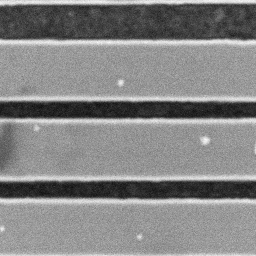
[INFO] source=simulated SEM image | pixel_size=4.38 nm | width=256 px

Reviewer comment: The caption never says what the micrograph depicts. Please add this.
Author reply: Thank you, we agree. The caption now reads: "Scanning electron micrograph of lines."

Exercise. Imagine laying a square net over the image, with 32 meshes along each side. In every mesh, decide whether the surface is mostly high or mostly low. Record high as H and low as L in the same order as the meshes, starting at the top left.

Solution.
HHHHHHHHHHHLLHHHLLLLLLLLLLLLLLLL
LLLLLLLLLLLLLLLLLLLLLLLLLLLLLLLL
LLLLLLLLLLLLLLLLLLLLLLLLLLLLLLLL
LLLLLLLLLLLLLLLLLLLLLLLLLLLLLLLL
LLLLLLLLLLLLLLLLLLLLLLLLLLLLLLLL
HHHHHHHHHHHHHHHHHHHHHHHHHHHHHHHH
HHHHHHHHHHHHHHHHHHHHHHHHHHHHHHHH
HHHHHHHHHHHHHHHHHHHHHHHHHHHHHHHH
HHHHHHHHHHHHHHHHHHHHHHHHHHHHHHHH
HHHHHHHHHHHHHHHHHHHHHHHHHHHHHHHH
HHHHHHHHHHHHHHHHHHHHHHHHHHHHHHHH
HHHHHHHHHHHHHHHHHHHHHHHHHHHHHHHH
HHHHHHHHHHHHHHHHHHHHHHHHHHHHHHHH
LLLLLLLLLLLLLLLLLLLLLLLLLLLLLLLL
LLLLLLLLLLLLLLLLLLLLLLLLLLLLLLLL
HHHHHHHHHHHHHHHHHHHHHHHHHHHHHHHH
HHHHHHHHHHHHHHHHHHHHHHHHHHHHHHHH
HHHHHHHHHHHHHHHHHHHHHHHHHHHHHHHH
HHHHHHHHHHHHHHHHHHHHHHHHHHHHHHHH
HHHHHHHHHHHHHHHHHHHHHHHHHHHHHHHH
HHHHHHHHHHHHHHHHHHHHHHHHHHHHHHHH
HHHHHHHHHHHHHHHHHHHHHHHHHHHHHHHH
HHHHHHHHHHHHHHHHHHHHHHHHHHHHHLLL
LLLLLLLLLLLLLLLLLLLLLLLLLLLLLLLL
LLLLLLLLLLLLLLLLLLLLLLLLLLLLLLLL
HHHHHHHHHHHHHHHHHHHHHHHHHHHHHHHH
HHHHHHHHHHHHHHHHHHHHHHHHHHHHHHHH
HHHHHHHHHHHHHHHHHHHHHHHHHHHHHHHH
HHHHHHHHHHHHHHHHHHHHHHHHHHHHHHHH
HHHHHHHHHHHHHHHHHHHHHHHHHHHHHHHH
HHHHHHHHHHHHHHHHHHHHHHHHHHHHHHHH
HHHHHHHHHHHHHHHHHHHHHHHHHHHHHHHH